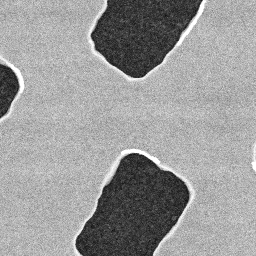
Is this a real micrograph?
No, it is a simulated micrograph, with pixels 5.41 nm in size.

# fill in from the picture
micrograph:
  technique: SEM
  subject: holes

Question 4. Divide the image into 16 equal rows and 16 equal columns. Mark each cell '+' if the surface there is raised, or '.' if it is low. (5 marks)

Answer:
+++++++.....++++
++++++......++++
++++++.....+++++
++++++....++++++
.+++++++.+++++++
.+++++++++++++++
.+++++++++++++++
++++++++++++++++
++++++++++++++++
++++++++++++++++
+++++++...++++++
+++++++.....++++
++++++......++++
++++++.....+++++
+++++......+++++
+++++.....++++++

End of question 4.